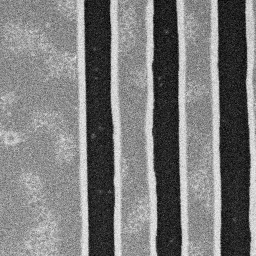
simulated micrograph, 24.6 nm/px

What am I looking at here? one or a few lines or trenches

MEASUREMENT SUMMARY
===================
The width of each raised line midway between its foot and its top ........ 815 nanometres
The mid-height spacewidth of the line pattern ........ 826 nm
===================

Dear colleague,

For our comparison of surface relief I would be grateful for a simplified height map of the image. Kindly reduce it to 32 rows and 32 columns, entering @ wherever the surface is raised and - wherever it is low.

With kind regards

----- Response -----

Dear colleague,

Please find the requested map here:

@@@@@@@@@@----@@@@@----@@@@----@
@@@@@@@@@@----@@@@@----@@@@----@
@@@@@@@@@@----@@@@@----@@@@----@
@@@@@@@@@@----@@@@@----@@@@----@
@@@@@@@@@@----@@@@@----@@@@----@
@@@@@@@@@@----@@@@@----@@@@----@
@@@@@@@@@@----@@@@@----@@@@----@
@@@@@@@@@@----@@@@@----@@@@----@
@@@@@@@@@@----@@@@@----@@@@----@
@@@@@@@@@@----@@@@@----@@@@----@
@@@@@@@@@@----@@@@@----@@@@----@
@@@@@@@@@@----@@@@@----@@@@----@
@@@@@@@@@@----@@@@@----@@@@----@
@@@@@@@@@@----@@@@@----@@@@----@
@@@@@@@@@@----@@@@@----@@@@----@
@@@@@@@@@@-----@@@@----@@@@-----
@@@@@@@@@@-----@@@@----@@@@-----
@@@@@@@@@@-----@@@@----@@@@-----
@@@@@@@@@@-----@@@@----@@@@-----
@@@@@@@@@@-----@@@@----@@@@-----
@@@@@@@@@@-----@@@@----@@@@-----
@@@@@@@@@@-----@@@@----@@@@-----
@@@@@@@@@@-----@@@@----@@@@-----
@@@@@@@@@@-----@@@@----@@@@-----
@@@@@@@@@@-----@@@@----@@@@-----
@@@@@@@@@@@----@@@@----@@@@-----
@@@@@@@@@@@----@@@@----@@@@-----
@@@@@@@@@@@----@@@@----@@@@-----
@@@@@@@@@@@----@@@@----@@@@-----
@@@@@@@@@@@----@@@@----@@@@-----
@@@@@@@@@@@----@@@@----@@@@-----
@@@@@@@@@@@----@@@@----@@@@-----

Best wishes